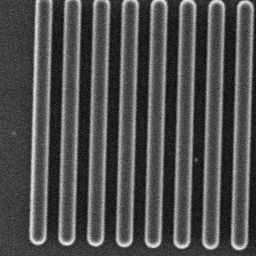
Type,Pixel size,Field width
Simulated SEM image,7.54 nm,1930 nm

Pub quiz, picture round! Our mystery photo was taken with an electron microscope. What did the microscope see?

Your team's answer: groups of lines, slits or small figures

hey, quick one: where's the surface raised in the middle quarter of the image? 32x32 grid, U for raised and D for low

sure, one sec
UUUUDDDUUUUDDDUUUUDDDDUUUDDDDUUU
UUUUDDDUUUUDDDUUUUDDDDUUUDDDDUUU
UUUDDDDUUUUDDDUUUUDDDDUUUDDDDUUU
UUUDDDDUUUUDDDUUUUDDDDUUUDDDDUUU
UUUDDDDUUUUDDDUUUUDDDDUUUDDDDUUU
UUUDDDDUUUUDDDUUUUDDDUUUUDDDDUUU
UUUDDDDUUUUDDDUUUUDDDUUUUDDDDUUU
UUUDDDDUUUUDDDUUUUDDDUUUUDDDDUUU
UUUDDDDUUUUDDDUUUUDDDUUUUDDDDUUU
UUUDDDDUUUUDDDUUUUDDDUUUUDDDUUUU
UUUDDDDUUUUDDDUUUUDDDUUUUDDDUUUU
UUUDDDDUUUUDDDUUUUDDDUUUUDDDUUUU
UUUDDDDUUUUDDDUUUUDDDUUUUDDDUUUU
UUUDDDDUUUUDDDUUUUDDDUUUUDDDUUUU
UUUDDDDUUUUDDDUUUUDDDUUUUDDDUUUU
UUUDDDDUUUDDDDUUUUDDDUUUUDDDUUUU
UUUDDDDUUUDDDDUUUUDDDUUUUDDDUUUU
UUUDDDDUUUDDDDUUUUDDDUUUUDDDUUUU
UUUDDDDUUUDDDDUUUUDDDUUUUDDDUUUU
UUUDDDDUUUDDDDUUUDDDDUUUUDDDUUUU
UUUDDDDUUUDDDDUUUDDDDUUUUDDDUUUU
UUUDDDDUUUDDDDUUUDDDDUUUUDDDUUUU
UUUDDDDUUUDDDDUUUDDDDUUUUDDDUUUU
UUUDDDUUUUDDDDUUUDDDDUUUUDDDUUUU
UUUDDDUUUUDDDDUUUDDDDUUUUDDDUUUU
UUUDDDUUUUDDDDUUUDDDDUUUUDDDUUUU
UUUDDDUUUUDDDDUUUDDDDUUUUDDDUUUU
UUUDDDUUUUDDDDUUUDDDDUUUUDDDUUUU
UUUDDDUUUUDDDDUUUDDDDUUUUDDDUUUU
UUUDDDUUUUDDDDUUUDDDDUUUUDDDUUUU
UUUDDDUUUUDDDDUUUDDDDUUUUDDDUUUU
UUUDDDUUUUDDDDUUUDDDDUUUUDDDUUUU